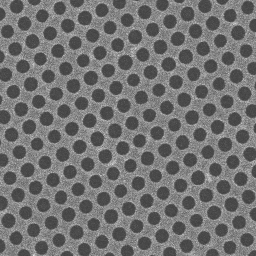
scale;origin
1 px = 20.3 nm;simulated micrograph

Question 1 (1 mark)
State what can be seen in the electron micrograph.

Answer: a regular array of holes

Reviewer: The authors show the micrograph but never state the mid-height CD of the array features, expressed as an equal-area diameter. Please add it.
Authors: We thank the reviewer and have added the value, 0.287 micrometres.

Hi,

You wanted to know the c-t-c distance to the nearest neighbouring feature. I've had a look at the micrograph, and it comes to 385 nm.